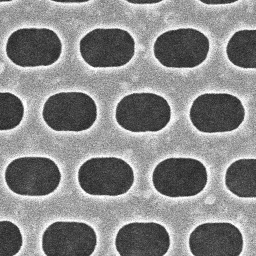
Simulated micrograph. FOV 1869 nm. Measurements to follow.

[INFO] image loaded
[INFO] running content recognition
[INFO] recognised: a regular array of holes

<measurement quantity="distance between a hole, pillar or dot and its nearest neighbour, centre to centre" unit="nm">538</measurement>